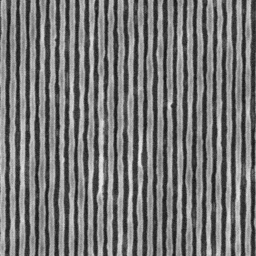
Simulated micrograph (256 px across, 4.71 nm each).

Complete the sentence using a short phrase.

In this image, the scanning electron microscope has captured parallel lines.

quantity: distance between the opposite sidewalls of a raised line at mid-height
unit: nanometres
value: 23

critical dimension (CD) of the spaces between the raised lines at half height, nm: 23.6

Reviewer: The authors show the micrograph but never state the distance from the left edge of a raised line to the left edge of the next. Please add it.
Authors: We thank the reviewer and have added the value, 0.0462 micrometres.